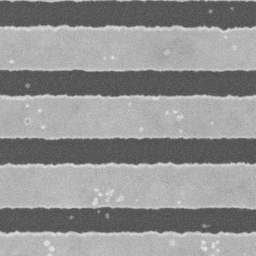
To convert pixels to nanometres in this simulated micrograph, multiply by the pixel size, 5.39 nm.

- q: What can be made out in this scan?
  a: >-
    lines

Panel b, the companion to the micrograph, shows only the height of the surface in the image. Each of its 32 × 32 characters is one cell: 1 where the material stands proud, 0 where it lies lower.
00000000000000000000000000000000
00000000000000000000000000000000
00000000000000000000000000000000
11111111111111111111111011100011
11111111111111111111111111111111
11111111111111111111111111111111
11111111111111111111111111111111
11111111111111111111111111111111
11111111111111111111111111111111
00000000000000000000000000000000
00000000000000000000000000000000
00000000000000000000000000000000
11111111111111111111111111111111
11111111111111111111111111111111
11111111111111111111111111111111
11111111111111111111111111111111
11111111111111111111111111111111
00000000000000000000000000000000
00000000000000000000000000000000
00000000000000000000000000000000
00001000100001110001110111111110
11111111111111111111111111111111
11111111111111111111111111111111
11111111111111111111111111111111
11111111111111111111111111111111
11111111111111111111111111111111
00000000000000000000000000000000
00000000000000000000000000000000
00000000000000000000000000000000
11111111111111111111111111111111
11111111111111111111111111111111
11111111111111111111111111111111